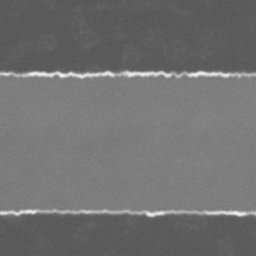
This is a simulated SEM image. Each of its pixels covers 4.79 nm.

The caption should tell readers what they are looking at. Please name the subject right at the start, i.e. one or a few lines or trenches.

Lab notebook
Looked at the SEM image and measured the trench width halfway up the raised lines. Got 653 nanometres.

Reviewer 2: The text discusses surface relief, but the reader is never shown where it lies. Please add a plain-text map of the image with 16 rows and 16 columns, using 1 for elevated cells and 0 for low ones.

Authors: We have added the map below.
1111111111111111
1111111111111111
1111111111111111
1111111111111111
1111111111111111
0000000000000000
0000000000000000
0000000000000000
0000000000000000
0000000000000000
0000000000000000
0000000000000000
0000000000000000
1111111111111111
1111111111111111
1111111111111111